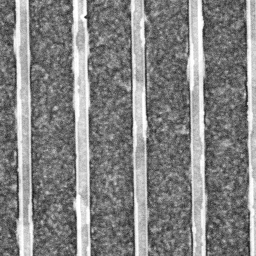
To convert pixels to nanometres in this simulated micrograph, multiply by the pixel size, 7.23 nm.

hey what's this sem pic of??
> parallel lines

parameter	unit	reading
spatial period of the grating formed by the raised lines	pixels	57.8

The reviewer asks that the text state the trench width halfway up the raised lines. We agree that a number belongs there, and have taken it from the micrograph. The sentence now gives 333 nanometers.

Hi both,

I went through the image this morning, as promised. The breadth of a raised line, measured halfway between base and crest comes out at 85.9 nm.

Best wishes